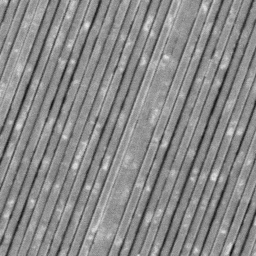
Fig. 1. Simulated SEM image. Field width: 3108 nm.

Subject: parallel lines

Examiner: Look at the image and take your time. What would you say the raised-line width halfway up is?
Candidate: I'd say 7.5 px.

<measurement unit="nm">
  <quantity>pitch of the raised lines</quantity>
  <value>116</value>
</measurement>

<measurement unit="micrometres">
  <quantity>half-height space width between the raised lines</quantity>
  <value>0.0299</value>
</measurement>